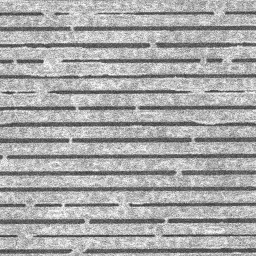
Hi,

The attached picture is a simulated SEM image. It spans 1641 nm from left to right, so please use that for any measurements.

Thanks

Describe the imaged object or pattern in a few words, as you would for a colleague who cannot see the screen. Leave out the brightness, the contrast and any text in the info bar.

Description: parallel lines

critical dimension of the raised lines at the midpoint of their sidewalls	72.1	nm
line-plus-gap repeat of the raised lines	0.102	µm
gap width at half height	29.6	nm